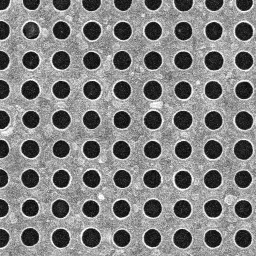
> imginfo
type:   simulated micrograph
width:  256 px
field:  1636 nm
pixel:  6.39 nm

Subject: a regular array of holes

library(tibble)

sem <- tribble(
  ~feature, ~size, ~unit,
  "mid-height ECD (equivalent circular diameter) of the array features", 18.5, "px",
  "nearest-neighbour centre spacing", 188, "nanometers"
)